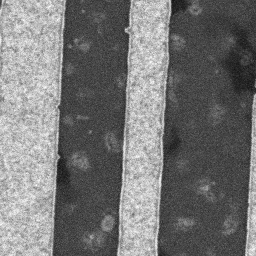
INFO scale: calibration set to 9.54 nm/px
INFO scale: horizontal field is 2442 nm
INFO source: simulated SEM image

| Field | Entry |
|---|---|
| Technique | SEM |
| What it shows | one or a few lines or trenches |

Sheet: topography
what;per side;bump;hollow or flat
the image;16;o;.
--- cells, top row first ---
oooo....ooo.....
oooo....ooo.....
oooo....oo......
oooo....ooo.....
oooo....oo......
oooo....oo......
oooo....oo......
oooo....oo......
oooo....oo......
oooo....oo......
oooo....oo......
ooo.....oo......
ooo.....oo......
ooo.....oo......
ooo....ooo.....o
ooo....ooo.....o